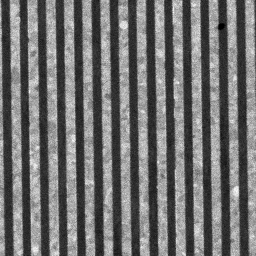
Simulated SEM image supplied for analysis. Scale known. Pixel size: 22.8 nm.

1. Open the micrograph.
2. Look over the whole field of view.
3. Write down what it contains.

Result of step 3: parallel lines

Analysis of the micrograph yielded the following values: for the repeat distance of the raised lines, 0.413 micrometres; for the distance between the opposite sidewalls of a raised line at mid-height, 0.203 microns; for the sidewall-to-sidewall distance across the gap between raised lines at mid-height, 211 nm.